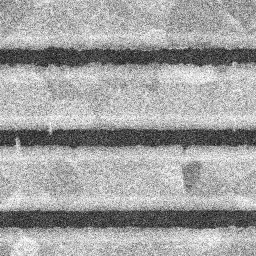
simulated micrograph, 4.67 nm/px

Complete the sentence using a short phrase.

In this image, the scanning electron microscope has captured one or a few lines or trenches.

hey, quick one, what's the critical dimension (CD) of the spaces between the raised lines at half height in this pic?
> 157 nanometres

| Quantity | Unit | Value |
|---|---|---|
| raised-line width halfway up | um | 0.225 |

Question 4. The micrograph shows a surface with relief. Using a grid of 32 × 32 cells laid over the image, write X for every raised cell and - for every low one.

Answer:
XXXXXXXXXXXXXXXXXXXXXXXXXXXXXXXX
XXXXXXXXXXXXXXXXXXXXXXXXXXXXXXXX
XXXXXXXXXXXXXXXXXXXXXXXXXXXXXXXX
XXXXXXXXXXXXXXXXXXXXXXXXXXXXXXXX
XXXXXXXXXXXXXXXXXXXXXXXXXXXXXXXX
--------------------------------
--------------------------------
--------------------------------
--------------------------------
XXXXXXXXXXXXXXXXXXXXXXXXXXXXXXXX
XXXXXXXXXXXXXXXXXXXXXXXXXXXXXXXX
XXXXXXXXXXXXXXXXXXXXXXXXXXXXXXXX
XXXXXXXXXXXXXXXXXXXXXXXXXXXXXXXX
XXXXXXXXXXXXXXXXXXXXXXXXXXXXXXXX
XXXXXXXXXXXXXXXXXXXXXXXXXXXXXXXX
--------------------------------
--------------------------------
--------------------------------
--------------------------------
XXXXXXXXXXXX-XXXXXXXXXXXXXXXXXXX
XXXXXXXXXXXXXXXXXXXXXXXXXXXXXXXX
XXXXXXXXXXXXXXXXXXXXXXXXXXXXXXXX
XXXXXXXXXXXXXXXXXXXXXXXXXXXXXXXX
XXXXXXXXXXXXXXXXXXXXXXXXXXXXXXXX
XXXXXXXXXXXXXXXXXXXXXXXXXXXXXXXX
--------------------------------
--------------------------------
--------------------------------
--------------------------------
--------------------XXXX-XXX----
XXXXXXXXXXXXXXXXXXXXXXXXXXXXXXXX
XXXXXXXXXXXXXXXXXXXXXXXXXXXXXXXX